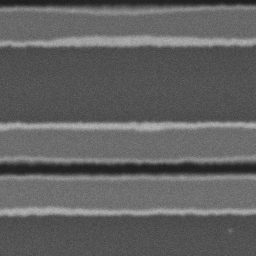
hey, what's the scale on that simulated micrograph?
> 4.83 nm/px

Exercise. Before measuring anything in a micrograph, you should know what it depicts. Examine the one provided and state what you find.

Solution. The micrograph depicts lines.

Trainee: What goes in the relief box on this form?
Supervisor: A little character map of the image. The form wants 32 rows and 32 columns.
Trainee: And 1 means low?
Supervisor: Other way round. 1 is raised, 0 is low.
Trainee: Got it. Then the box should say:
00000000000000000000000000000000
11111111111111111111111111111111
11111111111111111111111111111111
11111111111111111111111111111111
11111111111111111111111111111111
11111111111000100000010001101010
00000000000000000000000000000000
00000000000000000000000000000000
00000000000000000000000000000000
00000000000000000000000000000000
00000000000000000000000000000000
00000000000000000000000000000000
00000000000000000000000000000000
00000000000000000000000000000000
00000000000000000000000000000000
00000000000000000000000000111100
11111111111111111111111111111111
11111111111111111111111111111111
11111111111111111111111111111111
11111111111111111111111111111111
00000000000000000000000000000000
00000000000000000000000000000000
11111111111111111111111111111111
11111111111111111111111111111111
11111111111111111111111111111111
11111111111111111111111111111111
11111111111111111111111111111111
00000000000000000000000000000000
00000000000000000000000000000000
00000000000000000000000000000000
00000000000000000000000000000000
00000000000000000000000000000000